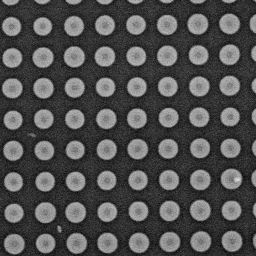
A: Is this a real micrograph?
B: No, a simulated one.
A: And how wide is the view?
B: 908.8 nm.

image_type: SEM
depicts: an array of small figures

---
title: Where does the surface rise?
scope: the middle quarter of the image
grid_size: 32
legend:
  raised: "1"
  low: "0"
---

01110000011000000000000000000000
00000000000000000000000000000000
00000000000000000000000000000000
00000000000000000110000001100000
01111000111100001111000011110000
11111000111110001111100011110001
11111000111110001111000011110001
01110000011100000111000011110000
00000000000000000000000000000000
00000000000000000000000000000000
00000000000000000000000000000000
00100000001100000110000001110000
01111000111110001111000011110000
11111000111110001111100011110001
11111000111110001111100011110000
01110000011100000111000001100000
00000000000000000000000000000000
00000000000000000000000000000000
00000000000000000000000000000000
00110000011100000111000011110000
01111000111110001111100011110000
01111000111110001111100011110000
01111000111110001111100011110000
00110000011100000111000001100000
00000000000000000000000000000000
00000000000000000000000000000000
00000000000000000000000000000000
01110000011100000111000011110000
01111000111110001111100011111000
01111000111110001111100011111000
01111000011110000111000011110000
00110000000000000000000000000000